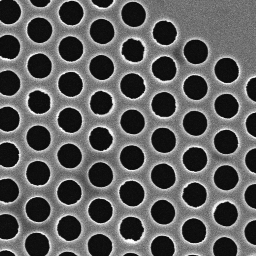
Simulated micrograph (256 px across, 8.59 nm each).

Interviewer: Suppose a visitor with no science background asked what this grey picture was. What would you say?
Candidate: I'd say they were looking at a regular array of holes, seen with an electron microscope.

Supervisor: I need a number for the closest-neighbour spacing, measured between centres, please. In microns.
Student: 0.306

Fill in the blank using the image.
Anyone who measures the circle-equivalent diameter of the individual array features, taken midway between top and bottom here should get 211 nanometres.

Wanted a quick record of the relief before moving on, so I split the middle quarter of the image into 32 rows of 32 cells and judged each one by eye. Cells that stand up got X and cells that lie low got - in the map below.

XXXXXX-------XXXXXXXXX------XXXX
XXXXXX-------XXXXXXXXX------XXXX
---XXXX-----XXXX--XXXX------XXXX
----XXXX---XXXX-----XXX----XXXX-
-----XXXXXXXXX------XXXXXXXXXX--
-----XXXXXXXXX------XXXXXXXXXX--
----XXXXXXXXXX------XXXXXXXXXX--
----XXX----XXXX-----XXX----XXX--
XXXXXXX-----XXXXX-XXXX------XXX-
XXXXXXX-----XXXXXXXXXX------XXXX
XXXXXXX-----XXXXXXXXXX------XXXX
---XXXX----XXXXX--XXXX------XXXX
----XXXX--XXXXX----XXXX----XXXX-
----XXXXXXXXXX------XXXXXXXXXX--
-----XXXXXXXXX------XXXXXXXXXX--
----XXXXXXXXXX------XXXXXXXXXX--
----XXX----XXXX-----XXX----XXX--
XXXXXXX-----XXXXX-XXXX------XXX-
XXXXXX------XXXXXXXXXX------XXXX
XXXXXX------XXXXXXXXXX------XXXX
---XXXX-----XXXX--XXXX------XXXX
----XXXX--XXXXX----XXXX----XXXX-
----XXXXXXXXXX------XXXXXXXXXX--
-----XXXXXXXXX------XXXXXXXXXX--
----XXXXXXXXXX------XXXXXXXXXX--
---XXXX----XXXX----XXXX----XXX--
XXXXXX------XXXX--XXXX-----XXXX-
XXXXXX------XXXXXXXXXX------XXXX
XXXXXX------XXXXXXXXXX------XXXX
---XXXX-----XXX---XXXX------XXXX
----XXXX---XXX-----XXXX----XXXX-
----XXXXXXXXXX------XXXXXXXXXX--